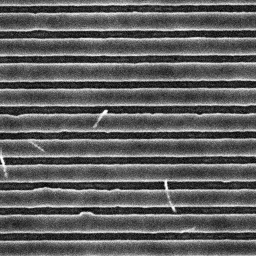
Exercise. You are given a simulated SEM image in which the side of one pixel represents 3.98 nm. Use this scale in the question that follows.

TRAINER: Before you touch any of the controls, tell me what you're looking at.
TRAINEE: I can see parallel lines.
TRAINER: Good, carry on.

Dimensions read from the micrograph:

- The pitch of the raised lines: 25.3 px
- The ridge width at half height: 70.7 nanometers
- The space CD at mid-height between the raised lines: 29.9 nm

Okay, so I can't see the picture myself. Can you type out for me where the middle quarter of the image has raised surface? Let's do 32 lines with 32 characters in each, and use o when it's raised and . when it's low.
oooooooooooooooooooooooooooooooo
oooooooooooooooooooooooooooooooo
oooooooooooooooooooooooooooooooo
oooooooooooooooooooooooooooooooo
................................
................................
oooooooooooooooooooooooooooooooo
oooooooooooooooooooooooooooooooo
oooooooooooooooooooooooooooooooo
oooooooooooooooooooooooooooooooo
................................
................................
o..oooo.ooooo.oo..oooo.oo.....oo
oooooooooooooooooooooooooooooooo
oooooooooooooooooooooooooooooooo
oooooooooooooooooooooooooooooooo
oooooooooooooooooooooooooooooooo
................................
................................
oooooooooooooooooooooooooooooooo
oooooooooooooooooooooooooooooooo
oooooooooooooooooooooooooooooooo
oooooooooooooooooooooooooooooooo
................................
................................
oooooooooooooooooooooooooooooooo
oooooooooooooooooooooooooooooooo
oooooooooooooooooooooooooooooooo
oooooooooooooooooooooooooooooooo
...o.....................o......
................................
ooo...oo....oo...........o......